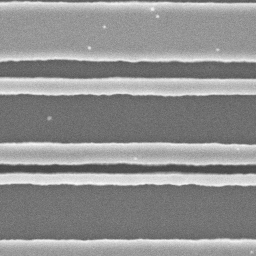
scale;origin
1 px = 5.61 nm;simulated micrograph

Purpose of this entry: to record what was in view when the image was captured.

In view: lines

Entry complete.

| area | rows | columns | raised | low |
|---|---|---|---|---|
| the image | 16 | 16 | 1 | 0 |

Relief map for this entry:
1111111111111111
1111111111111111
1111111111111111
1111111111111111
1111111111111111
1111111111111111
0000000000000000
0000000000000000
0000000000000000
1111111111111111
1111111111111111
0010101111111111
0000000000000000
0000000000000000
0000000000000000
1111111111111111